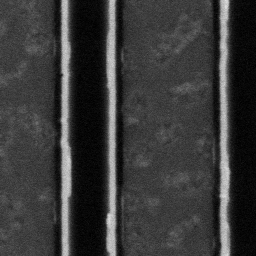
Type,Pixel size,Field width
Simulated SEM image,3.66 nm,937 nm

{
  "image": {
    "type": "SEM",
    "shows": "one or a few lines or trenches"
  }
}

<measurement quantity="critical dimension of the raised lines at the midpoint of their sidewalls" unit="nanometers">176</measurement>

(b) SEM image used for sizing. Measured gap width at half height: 406 nm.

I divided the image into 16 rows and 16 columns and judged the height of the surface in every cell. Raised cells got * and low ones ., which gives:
....***.......**
....***.......**
....***.......**
....***.......**
....***.......**
....***.......**
....***.......**
....***.......**
....***.......**
....***.......**
....***.......**
....***.......**
....***.......**
....***.......**
....***.......**
....***.......**